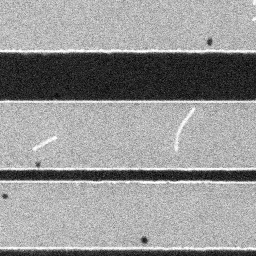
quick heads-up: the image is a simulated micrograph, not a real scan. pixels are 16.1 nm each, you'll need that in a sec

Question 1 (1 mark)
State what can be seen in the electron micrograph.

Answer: lines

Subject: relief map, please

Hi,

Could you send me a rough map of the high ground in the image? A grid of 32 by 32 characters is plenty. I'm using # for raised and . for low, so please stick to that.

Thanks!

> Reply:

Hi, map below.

................................
................................
................................
................................
................................
................................
################################
################################
################################
################################
################################
################################
################################
................................
................................
................................
................................
................................
................................
................................
................................
################################
################################
................................
................................
................................
................................
................................
................................
................................
................................
################################